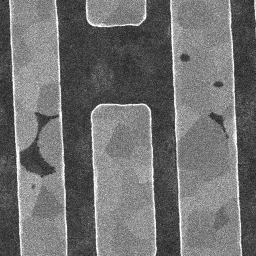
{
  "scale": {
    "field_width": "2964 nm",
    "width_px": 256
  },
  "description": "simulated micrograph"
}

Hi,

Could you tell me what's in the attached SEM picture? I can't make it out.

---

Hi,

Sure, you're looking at one or a few lines or trenches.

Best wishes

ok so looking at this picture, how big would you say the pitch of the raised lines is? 0.967 µm